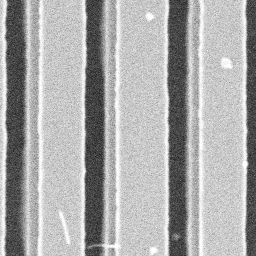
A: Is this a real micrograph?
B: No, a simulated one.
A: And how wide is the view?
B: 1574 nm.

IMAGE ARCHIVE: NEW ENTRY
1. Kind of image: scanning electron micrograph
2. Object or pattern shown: lines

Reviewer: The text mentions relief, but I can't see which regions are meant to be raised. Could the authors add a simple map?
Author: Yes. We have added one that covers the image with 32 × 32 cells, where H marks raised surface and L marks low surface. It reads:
HLLHHHHHHHHLLHHHHHHHHLLLHHHHHHHL
HLLHHHHHHHHLLHHHHHHHHLLLHHHHHHHL
HLLHHHHHHHHLLHHHHHHHHLLLHHHHHHHL
HLLHHHHHHHHLLHHHHHHHHLLLHHHHHHHL
HLLHHHHHHHHLLHHHHHHHHLLLHHHHHHHL
HLLLHHHHHHHLLHHHHHHHHLLLHHHHHHHL
HLLHHHHHHHHLLHHHHHHHHLLLHHHHHHHL
HLLHHHHHHHHLLHHHHHHHHLLLHHHHHHHL
HLLLHHHHHHHLLHHHHHHHHLLLHHHHHHHL
HLLHHHHHHHHLLHHHHHHHHLLLHHHHHHHL
HLLHHHHHHHLLLHHHHHHHHLLLHHHHHHHL
HLLHHHHHHHLLLHHHHHHHHLLLHHHHHHHL
HLLHHHHHHHLLLHHHHHHHHLLLHHHHHHHL
HLLHHHHHHHLLLHHHHHHHHLLLHHHHHHHL
HLLHHHHHHHLLLHHHHHHHHLLLHHHHHHHL
HLLHHHHHHHLLLHHHHHHHHLLLHHHHHHHL
HLLHHHHHHHHLLHHHHHHHHLLLHHHHHHHL
HLLHHHHHHHLLLHHHHHHHHLLLHHHHHHHL
HLLHHHHHHHLLLHHHHHHHHLLLHHHHHHHL
HLLHHHHHHHLLLHHHHHHHHLLLHHHHHHHL
HLLHHHHHHHLLLHHHHHHHHLLLHHHHHHHL
HLLHHHHHHHHLLHHHHHHHHLLLHHHHHHHL
HLLHHHHHHHLLLHHHHHHHHLLLHHHHHHHL
HLLHHHHHHHLLLHHHHHHHHLLLHHHHHHHL
HLLHHHHHHHLLLHHHHHHHHLLLHHHHHHHL
HLLHHHHHHHLLLHHHHHHHHLLLHHHHHHHL
HLLHHHHHHHLLLHHHHHHHHLLLHHHHHHHL
HLLHHHHHHHLLLHHHHHHHHLLLHHHHHHHL
HLLHHHHHHHLLLHHHHHHHHLLLHHHHHHHL
HLLHHHHHHHLLLHHHHHHHHLLLHHHHHHHL
HLLHHHHHHHLLLHHHHHHHHLLLHHHHHHHL
HLLHHHHHHHLLLHHHHHHHHLLLHHHHHHHL